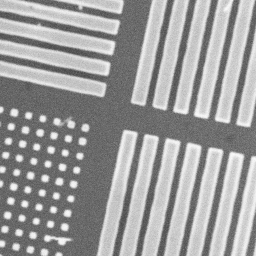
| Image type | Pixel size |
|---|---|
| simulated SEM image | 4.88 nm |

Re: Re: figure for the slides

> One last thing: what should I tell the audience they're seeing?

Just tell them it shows groups of lines, slits or small figures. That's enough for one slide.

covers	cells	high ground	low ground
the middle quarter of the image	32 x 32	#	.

###########........###..####..##
....#######........###..####..##
.........##.......####..###..###
####..............####..###..###
#########.........###..####..###
##########........###..####..###
.#########.......####..###...###
.......###.......####..###..####
.................####..###..###.
.................###..####..###.
......................####..###.
............................###.
................................
................................
................................
.#...#..........................
.....#..........................
...............###..............
.#.............###..###.........
....#.........####..###...##....
..............###...###..####..#
..............###...###..####..#
#.............###..####..###...#
..............###..###...###..##
..............##...###...###..##
.............###...###..####..##
...#.........###...###..###...##
.............###...###..###..###
............####..###...###..###
............####..###...###..###
..#.........###...###..####..###
............###..####..###...###